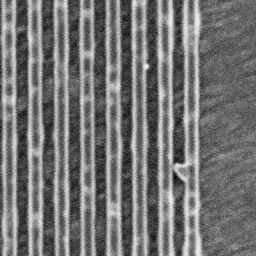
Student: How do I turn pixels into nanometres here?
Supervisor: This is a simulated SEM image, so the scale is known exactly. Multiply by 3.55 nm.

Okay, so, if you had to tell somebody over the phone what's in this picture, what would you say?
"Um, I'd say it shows parallel lines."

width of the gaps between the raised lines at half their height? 48.4 nm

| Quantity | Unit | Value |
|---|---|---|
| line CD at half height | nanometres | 42.7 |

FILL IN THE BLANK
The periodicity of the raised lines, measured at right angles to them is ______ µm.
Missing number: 0.0925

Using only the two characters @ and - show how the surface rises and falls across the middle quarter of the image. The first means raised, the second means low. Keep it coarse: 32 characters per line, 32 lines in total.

@---@@@----@@@---@@@@---@@@---@@
@---@@@----@@@---@@@----@@@----@
@---@@@----@@@---@@@----@@@----@
@---@@@----@@@---@@@----@@@---@@
@---@@@----@@@---@@@----@@@---@@
@---@@@----@@@---@@@----@@@---@@
@---@@@----@@@---@@@----@@@---@@
@---@@@----@@@---@@@----@@@---@@
@---@@@----@@@---@@@----@@@---@@
@---@@@----@@@---@@@----@@@---@@
@---@@@----@@@---@@@----@@@---@@
@---@@@----@@@---@@@----@@@---@@
@---@@@----@@@---@@@----@@@---@@
@---@@@----@@@---@@@----@@@---@@
@---@@@----@@@---@@@----@@@---@@
@---@@@----@@@---@@@----@@@---@@
@---@@@----@@@---@@@----@@@---@@
@---@@@----@@@---@@@----@@@---@@
@---@@@----@@@---@@@----@@@---@@
@---@@@----@@@---@@@----@@@----@
@---@@@----@@@---@@@----@@@---@@
@---@@@----@@@---@@@----@@@---@@
@---@@@----@@@---@@@----@@@---@@
@---@@@----@@@---@@@----@@@---@@
@---@@@----@@@---@@@----@@@---@@
@---@@@----@@@---@@@----@@@-@@@@
@---@@@----@@@---@@@----@@@-@@@@
@---@@@----@@@---@@@----@@@-@@@@
@---@@@----@@@---@@@----@@@--@@@
@---@@@----@@@---@@@----@@@---@@
@---@@@----@@@---@@@----@@@----@
@---@@@----@@@----@@----@@@----@